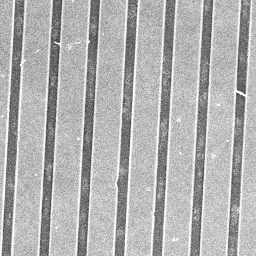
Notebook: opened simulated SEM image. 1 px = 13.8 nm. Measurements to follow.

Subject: parallel lines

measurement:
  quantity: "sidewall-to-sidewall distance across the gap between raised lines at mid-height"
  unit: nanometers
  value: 145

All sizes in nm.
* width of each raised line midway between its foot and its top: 376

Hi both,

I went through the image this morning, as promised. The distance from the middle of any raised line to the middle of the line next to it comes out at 520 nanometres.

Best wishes